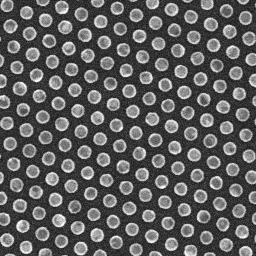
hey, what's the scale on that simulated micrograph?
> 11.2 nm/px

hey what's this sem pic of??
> a regular array of raised bodies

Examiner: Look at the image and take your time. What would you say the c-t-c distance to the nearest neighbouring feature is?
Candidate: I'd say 231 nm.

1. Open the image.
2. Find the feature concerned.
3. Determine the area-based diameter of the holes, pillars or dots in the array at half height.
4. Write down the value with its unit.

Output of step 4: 137 nm